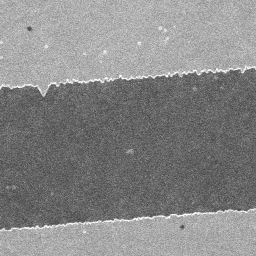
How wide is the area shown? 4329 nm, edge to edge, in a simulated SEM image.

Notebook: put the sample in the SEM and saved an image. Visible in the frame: one or a few lines or trenches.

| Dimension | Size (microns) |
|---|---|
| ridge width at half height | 2.39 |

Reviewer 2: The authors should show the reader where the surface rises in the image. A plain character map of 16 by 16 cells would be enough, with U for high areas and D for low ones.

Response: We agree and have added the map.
DDDDDDDDDDDDDDDD
DDDDDDDDDDDDDDDD
DDDDDDDDDDDDDDDD
DDDDDDDDDDDDDDDD
DDDDDDDDDDDDUUUU
UUDUUUUUUUUUUUUU
UUUUUUUUUUUUUUUU
UUUUUUUUUUUUUUUU
UUUUUUUUUUUUUUUU
UUUUUUUUUUUUUUUU
UUUUUUUUUUUUUUUU
UUUUUUUUUUUUUUUU
UUUUUUUUUUUUUUUU
UUUUUUUUUUUDDDDD
DDDDDDDDDDDDDDDD
DDDDDDDDDDDDDDDD